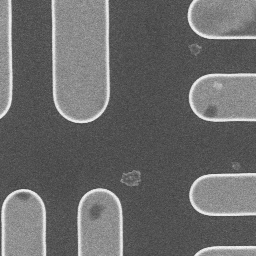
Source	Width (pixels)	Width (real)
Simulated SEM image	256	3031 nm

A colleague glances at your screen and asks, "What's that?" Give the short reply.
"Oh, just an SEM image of groups of lines, slits or small figures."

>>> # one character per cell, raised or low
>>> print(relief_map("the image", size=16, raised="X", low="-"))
X--XXXX-----XXXX
X--XXXX-----XXXX
X--XXXX---------
X--XXXX---------
X--XXXX---------
X--XXXX-----XXXX
X--XXXX-----XXXX
----XX-------XXX
----------------
----------------
----------------
------------XXXX
XXX--XX-----XXXX
XXX--XXX--------
XXX--XXX--------
XXX--XXX-----XXX